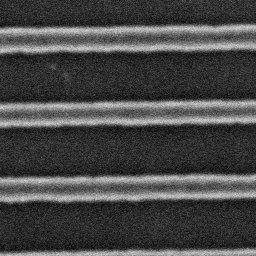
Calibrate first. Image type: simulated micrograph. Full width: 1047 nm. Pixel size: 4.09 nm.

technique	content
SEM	lines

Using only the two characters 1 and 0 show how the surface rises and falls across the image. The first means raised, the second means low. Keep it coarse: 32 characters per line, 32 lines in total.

00000000000000000000000000000000
00000000000000000000000000000000
00000000000000000000000000000000
00000000000000011111111111111111
11111111111111111111111111111111
11111111111111111111111111111111
10000000000000000000000000000000
00000000000000000000000000000000
00000000000000000000000000000000
00000000000000000000000000000000
00000000000000000000000000000000
00000000000000000000000000000000
00000000000000000000000000000000
11111111111111111111111111111111
11111111111111111111111111111111
11111111011100011100000000000000
00000000000000000000000000000000
00000000000000000000000000000000
00000000000000000000000000000000
00000000000000000000000000000000
00000000000000000000000000000000
00000000000000000000000000000000
11111111111111111111111111111111
11111111111111111111111111111111
11111111111111111111111111111111
00000000000000000000000000000000
00000000000000000000000000000000
00000000000000000000000000000000
00000000000000000000000000000000
00000000000000000000000000000000
00000000000000000000000000000000
00000000000000001100110111111111